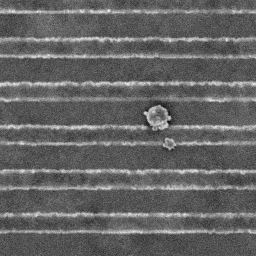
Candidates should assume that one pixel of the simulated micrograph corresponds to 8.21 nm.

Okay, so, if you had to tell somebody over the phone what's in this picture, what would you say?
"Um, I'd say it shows lines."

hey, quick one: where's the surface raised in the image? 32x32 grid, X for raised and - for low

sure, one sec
XXXXXXXXXXXXXXXXXXXXXXXXXXXXXXXX
-XXX-XXX-XXXX----------X-----XX-
--------------------------------
--------------------------------
--------------------------------
XXXXXXXXXXXXXXXXXXXXXXXXXXXXXXXX
XXXXXXXXXXXXXXXXXXXXXXXXXXXXXXXX
--------------------------------
--------------------------------
--------------------------------
XXXXXXXXXXXXXXXXXXXXXXXXXXXXXXXX
XXXXXXXXXXXXXXXXXXXXXXXXXXXXXXXX
XX-----------------------XXX---X
-------------------X------------
------------------XXX-----------
-------------------XX-----------
XXXXXXXXXXXXXXXXXXXXXXXXXXXXXXXX
XXXXXXXXXXXXXXXXXXXXXXXXXXXXXXXX
--------------------------------
--------------------------------
--------------------------------
XXXXXXXXXXXXXXXX-XXXXXXXXXXXXXXX
XXXXXXXXXXXXXXXXXXXXXXXXXXXXXXXX
--------------------------------
--------------------------------
--------------------------------
--------------------------------
XXXXXXXXXXXXXXXXXXXXXXXXXXXXXXXX
XXXXXXXXXXXXXXXXXXXXXXXXXXXXXXXX
--------------------------------
--------------------------------
--------------------------------